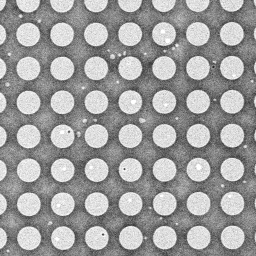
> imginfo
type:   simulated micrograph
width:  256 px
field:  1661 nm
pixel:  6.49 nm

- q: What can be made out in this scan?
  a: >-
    an array of small figures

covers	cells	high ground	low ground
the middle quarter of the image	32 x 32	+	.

++...++++++...+++++...++++++...+
++...++++++...+++++...++++++...+
++....++++....+++++....++++....+
+......+++.....+++......++......
................................
................................
................................
++....++++.....++++....++++.....
++....+++++...+++++...++++++...+
++...++++++...+++++...++++++...+
++...++++++...+++++...++++++...+
++....++++....+++++....++++.....
................................
................................
................................
+......++......+++......++......
++....++++....+++++....++++....+
++...++++++...+++++...++++++...+
++...++++++...+++++...++++++...+
++....+++++...+++++....++++....+
+......++......+++......++......
................................
................................
................................
++....++++.....++++....++++....+
++...++++++...+++++....+++++...+
++...++++++...+++++...++++++...+
++...++++++...+++++....+++++...+
++....++++.....++++....++++.....
................................
................................
................................